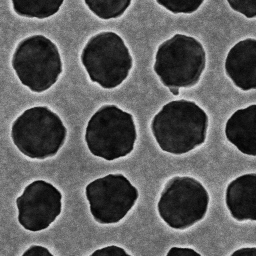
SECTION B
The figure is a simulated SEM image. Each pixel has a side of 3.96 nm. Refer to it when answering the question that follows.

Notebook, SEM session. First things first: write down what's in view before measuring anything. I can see a regular array of holes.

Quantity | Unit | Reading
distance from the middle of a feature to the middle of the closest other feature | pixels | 69.8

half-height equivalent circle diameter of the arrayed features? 0.202 µm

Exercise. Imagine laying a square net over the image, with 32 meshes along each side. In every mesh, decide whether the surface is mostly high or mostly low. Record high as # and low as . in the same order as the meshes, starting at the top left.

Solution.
##......###.....####.....####...
##.....#####...#######..######..
################################
################################
####.#######...#######.#########
###....####.....####.....#####..
##.....###......####......###...
##......##......###.......##....
##......###.....###......###....
##.....####.....####.....####...
###....#####...######...######..
################################
################################
####..#######..#####.....######.
###....#####....###.......###...
##......###......##.......##....
#.......###......##.......##....
##......###......###.....####...
##.....####......###....######..
###...######...#################
################################
################################
############....######..#####...
###....####......####.....##....
###.....###......###......##....
##......###......###......##....
##.....####.....####......###...
##.....#####...#####.....#######
###...################.#########
################################
################################
###...######....#####....####...